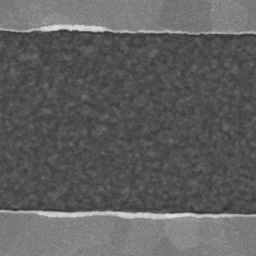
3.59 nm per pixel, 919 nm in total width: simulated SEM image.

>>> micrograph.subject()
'one or a few lines or trenches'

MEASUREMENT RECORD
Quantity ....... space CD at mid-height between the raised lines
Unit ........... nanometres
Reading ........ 652